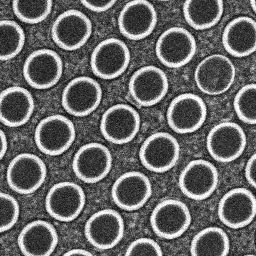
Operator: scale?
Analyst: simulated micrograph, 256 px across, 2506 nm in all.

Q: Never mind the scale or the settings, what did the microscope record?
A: a regular array of raised bodies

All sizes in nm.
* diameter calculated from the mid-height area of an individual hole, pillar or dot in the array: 352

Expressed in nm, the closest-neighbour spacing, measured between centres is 461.